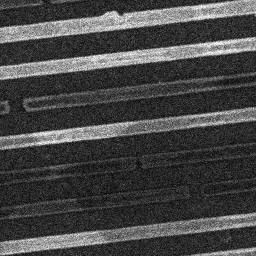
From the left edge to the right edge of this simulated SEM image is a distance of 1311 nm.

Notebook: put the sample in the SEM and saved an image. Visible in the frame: parallel lines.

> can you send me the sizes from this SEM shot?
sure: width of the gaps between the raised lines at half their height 0.118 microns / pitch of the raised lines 181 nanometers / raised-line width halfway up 63.6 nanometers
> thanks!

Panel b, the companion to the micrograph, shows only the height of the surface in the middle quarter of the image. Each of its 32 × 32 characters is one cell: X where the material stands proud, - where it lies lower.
XXXXXXXXXXXX--------------------
XXXX----------------------------
--------------------------------
--------------------------------
----------------------------XXXX
-------------------XXXXXXXXXXXXX
----------XXXXXXXXXXXXXXXXXXXXXX
---XXXXXXXXXXXXXXXXXXXXXXXX-----
XXXXXXXXXXXXXXXXXXX-------------
XXXXXXXXXX----------------------
X-------------------------------
--------------------------------
--------------------------------
---------------------------XXXXX
------------------XXXXXXXXXXXXXX
----------XXXXXXXXXXXXXXXXXXXXXX
-XXXXXXXXXXXXXXXXXXXXXXXX-------
XXXXXXXXXXXXXXXX----------------
XXXXXXXX------------------------
--------------------------------
--------------------------------
--------------------------------
-------------------------XXXXXXX
----------------X--XXXXXXXXXXXXX
-------XXXXXXXXXXX--XXXXXXXXXXX-
XXXXXXXXXXXXXXXXXX--XXXX--------
XXXXXXXXXXXXXXXX----------------
XXXXXXX-------------------------
--------------------------------
--------------------------------
--------------------------------
----------------------XXXXXXXXX-